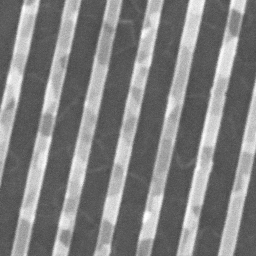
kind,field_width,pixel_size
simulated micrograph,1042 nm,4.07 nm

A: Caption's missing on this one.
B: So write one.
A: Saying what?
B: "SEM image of parallel lines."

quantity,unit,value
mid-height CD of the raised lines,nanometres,55.3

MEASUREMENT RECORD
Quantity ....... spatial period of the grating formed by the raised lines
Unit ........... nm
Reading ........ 165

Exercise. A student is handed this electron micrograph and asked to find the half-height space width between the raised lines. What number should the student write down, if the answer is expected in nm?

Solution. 111